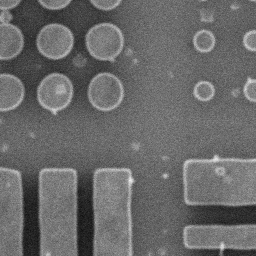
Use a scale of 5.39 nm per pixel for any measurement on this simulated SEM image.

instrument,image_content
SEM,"groups of lines, slits or small figures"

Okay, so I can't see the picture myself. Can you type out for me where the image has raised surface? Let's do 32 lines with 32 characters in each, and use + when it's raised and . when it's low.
++...+++....+++.................
................................
................................
++...+++....+++.................
+++..++++..++++.........+++....+
+++..++++..++++.........+++....+
++...++++..++++.................
................................
................................
++....++....++..................
+++..++++..++++..........+.....+
+++..++++..++++.........+++....+
+++..++++..++++................+
++....++....++..................
................................
................................
................................
................................
................................
................................
.......................+++++++++
++...++++...++++.......+++++++++
+++..++++...++++.......+++++++++
+++..++++...++++.......+++++++++
+++..++++...++++.......+++++++++
+++..++++...++++........++++++++
+++..++++...++++................
+++..++++...++++................
+++..++++...++++.......+++++++++
+++..++++...++++.......+++++++++
+++..++++...++++.......+++++++++
+++..+++++..++++................